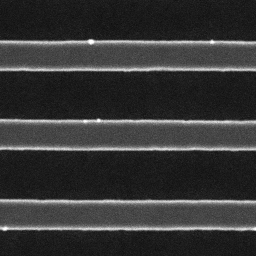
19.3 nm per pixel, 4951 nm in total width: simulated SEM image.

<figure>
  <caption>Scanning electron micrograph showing lines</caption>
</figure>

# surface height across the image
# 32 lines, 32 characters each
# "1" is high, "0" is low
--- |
00000000000000000000000000000000
00000000000000000000000000000000
00000000000000000000000000000000
00000000000000000000000000000000
00000000000000000000000000000000
11111111111111111111111111111111
11111111111111111111111111111111
11111111111111111111111111111111
11111111111111111111111111111111
00000000000000000000000000000000
00000000000000000000000000000000
00000000000000000000000000000000
00000000000000000000000000000000
00000000000000000000000000000000
00000000000000000000000000000000
11111111111111111111111111111111
11111111111111111111111111111111
11111111111111111111111111111111
11111111111111111111111111111111
00000000000000000000000000000000
00000000000000000000000000000000
00000000000000000000000000000000
00000000000000000000000000000000
00000000000000000000000000000000
00000000000000000000000000000000
11111111111111111111111111111111
11111111111111111111111111111111
11111111111111111111111111111111
11111111111111111111111111111111
00000000000000000000000000000000
00000000000000000000000000000000
00000000000000000000000000000000